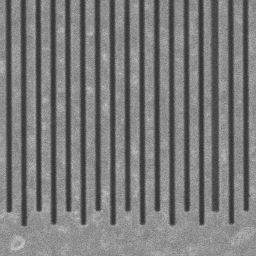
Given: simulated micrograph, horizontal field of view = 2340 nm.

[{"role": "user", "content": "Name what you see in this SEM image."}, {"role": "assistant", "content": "parallel lines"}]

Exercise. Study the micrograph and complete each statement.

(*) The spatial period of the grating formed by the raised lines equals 135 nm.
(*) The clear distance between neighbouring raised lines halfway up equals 46.8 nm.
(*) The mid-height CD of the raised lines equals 9.38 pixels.